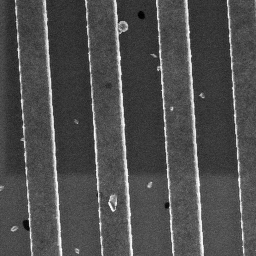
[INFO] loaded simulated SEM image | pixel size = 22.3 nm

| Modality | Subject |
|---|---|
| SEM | lines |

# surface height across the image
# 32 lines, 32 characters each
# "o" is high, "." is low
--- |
..oooo.....ooo......ooo.....oooo
..oooo.....oooo.....ooo......ooo
..oooo.....oooo.....ooo......ooo
..oooo.....oooo.....ooo......ooo
..oooo.....oooo.....oooo.....ooo
..oooo.....oooo.....oooo.....ooo
..oooo.....oooo.....oooo.....ooo
..oooo.....oooo.....oooo.....ooo
..oooo.....oooo.....oooo.....ooo
...ooo.....oooo.....oooo.....ooo
...ooo.....oooo.....oooo.....ooo
...ooo.....oooo.....oooo.....ooo
...ooo......ooo.....oooo.....ooo
...oooo.....ooo.....oooo.....ooo
...oooo.....ooo......ooo.....ooo
...oooo.....ooo......ooo.....ooo
...oooo.....ooo......ooo.....ooo
...oooo.....oooo.....ooo......oo
...oooo.....oooo.....oooo.....oo
...oooo.....oooo.....oooo.....oo
...oooo.....oooo.....oooo.....oo
...oooo.....oooo.....oooo.....oo
...oooo.....oooo.....oooo.....oo
...oooo.....oooo.....oooo.....oo
...oooo.....oooo.....oooo.....oo
....ooo.....oooo.....oooo.....oo
....ooo.....oooo.....oooo.....oo
....ooo.....oooo.....oooo.....oo
....ooo......ooo.....oooo.....oo
....ooo......ooo.....oooo.....oo
....oooo.....ooo......ooo.....oo
....oooo.....ooo......ooo.....oo